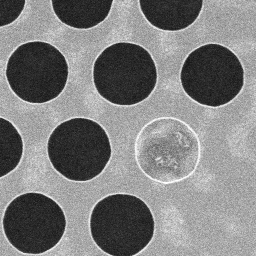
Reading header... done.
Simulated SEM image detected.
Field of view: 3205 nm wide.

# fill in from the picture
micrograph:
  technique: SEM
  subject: holes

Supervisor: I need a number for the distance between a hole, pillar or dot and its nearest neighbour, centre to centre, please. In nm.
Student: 1100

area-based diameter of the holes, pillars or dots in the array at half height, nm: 786